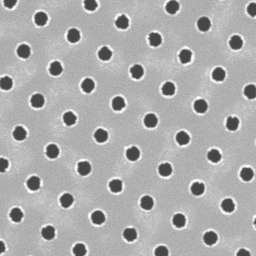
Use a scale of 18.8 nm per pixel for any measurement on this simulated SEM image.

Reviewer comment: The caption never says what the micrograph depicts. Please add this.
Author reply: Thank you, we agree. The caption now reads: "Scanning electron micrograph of a regular array of holes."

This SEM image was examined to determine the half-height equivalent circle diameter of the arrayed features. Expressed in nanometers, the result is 276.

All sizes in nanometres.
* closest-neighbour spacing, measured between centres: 678